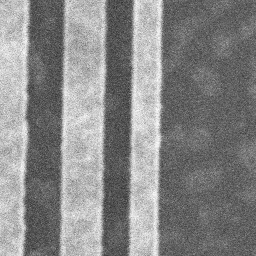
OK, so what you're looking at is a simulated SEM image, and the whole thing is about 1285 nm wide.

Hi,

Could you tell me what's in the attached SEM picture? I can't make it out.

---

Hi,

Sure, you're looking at one or a few lines or trenches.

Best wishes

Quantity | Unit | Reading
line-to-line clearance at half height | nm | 182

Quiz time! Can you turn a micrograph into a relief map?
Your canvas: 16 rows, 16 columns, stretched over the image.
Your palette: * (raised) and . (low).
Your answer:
**..**...*......
**..**..**......
**..**..**......
**..**..**......
**..**..**......
**..**..**......
**..**..**......
**..**..**......
**..**..**......
*...**..**......
*...**..**......
*...**..**......
*...**..**......
*...**..**......
*...**..**......
*...**..**......